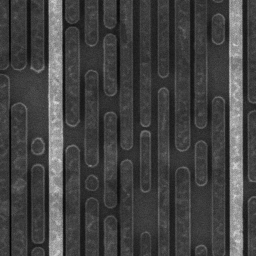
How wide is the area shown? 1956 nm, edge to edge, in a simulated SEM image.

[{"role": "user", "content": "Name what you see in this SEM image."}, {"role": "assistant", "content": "parallel lines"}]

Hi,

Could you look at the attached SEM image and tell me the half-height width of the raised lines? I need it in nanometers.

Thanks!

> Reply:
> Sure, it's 94.6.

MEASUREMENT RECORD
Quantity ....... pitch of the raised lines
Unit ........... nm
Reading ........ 138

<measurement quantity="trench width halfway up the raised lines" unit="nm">43.9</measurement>